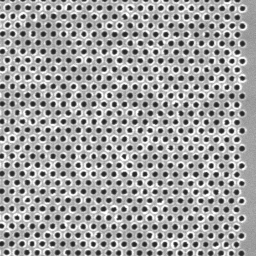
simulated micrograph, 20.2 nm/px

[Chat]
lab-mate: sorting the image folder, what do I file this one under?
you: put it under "a regular array of holes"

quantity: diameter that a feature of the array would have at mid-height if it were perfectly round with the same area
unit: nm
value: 121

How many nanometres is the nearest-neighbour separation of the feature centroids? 200